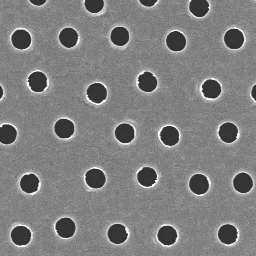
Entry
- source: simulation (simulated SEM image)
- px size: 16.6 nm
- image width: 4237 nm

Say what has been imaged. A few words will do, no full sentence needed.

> a regular array of holes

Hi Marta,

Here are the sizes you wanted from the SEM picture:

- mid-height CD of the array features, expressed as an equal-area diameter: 0.327 um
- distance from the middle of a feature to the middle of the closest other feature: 786 nm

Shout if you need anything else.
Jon